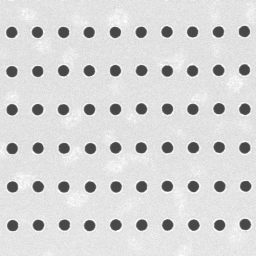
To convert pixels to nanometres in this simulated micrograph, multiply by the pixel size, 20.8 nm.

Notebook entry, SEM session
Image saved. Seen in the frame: a regular array of holes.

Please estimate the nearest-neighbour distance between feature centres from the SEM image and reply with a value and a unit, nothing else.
534 nm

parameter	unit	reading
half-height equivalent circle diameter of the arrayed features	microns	0.243